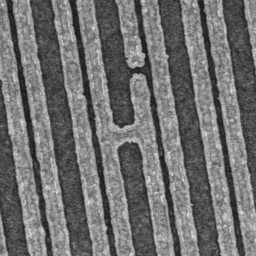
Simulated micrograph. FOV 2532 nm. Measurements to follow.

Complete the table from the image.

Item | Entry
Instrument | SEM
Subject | parallel lines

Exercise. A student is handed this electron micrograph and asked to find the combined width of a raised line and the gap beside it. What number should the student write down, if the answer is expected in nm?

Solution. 305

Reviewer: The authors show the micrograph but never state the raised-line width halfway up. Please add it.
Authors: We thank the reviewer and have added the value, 153 nm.